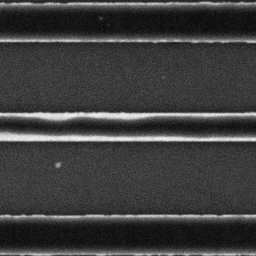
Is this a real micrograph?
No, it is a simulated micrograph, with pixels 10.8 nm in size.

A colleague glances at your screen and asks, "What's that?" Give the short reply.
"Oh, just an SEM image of lines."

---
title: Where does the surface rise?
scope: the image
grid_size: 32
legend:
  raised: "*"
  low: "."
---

.***.**..***********************
********************************
********************************
********************************
********************************
................................
................................
................................
................................
................................
................................
................................
................................
................................
********************************
********************************
********************************
........................*.......
................................
................................
................................
................................
................................
................................
................................
................................
................................
********************************
********************************
********************************
********************************
********************************